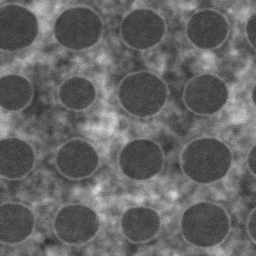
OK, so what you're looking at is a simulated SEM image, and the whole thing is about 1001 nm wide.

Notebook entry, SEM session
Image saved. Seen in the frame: a regular array of raised bodies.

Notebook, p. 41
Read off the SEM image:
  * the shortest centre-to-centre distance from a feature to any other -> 0.251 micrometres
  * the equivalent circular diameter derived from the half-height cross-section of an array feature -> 172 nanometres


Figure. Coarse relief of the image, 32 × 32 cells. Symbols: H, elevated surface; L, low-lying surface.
LHLLLLLLLLLLLLLLLLLLLLLLLLLLLLLL
HHHHLLLLHHHHLLLLHHHLLLLLHHHLLLLL
HHHHHLLHHHHHHLLHHHHHLLLHHHHHLLLH
HHHHHLLHHHHHHLLHHHHHHLLHHHHHHLLH
HHHHHLLHHHHHHLLHHHHHLLLHHHHHHLLH
HHHHLLLHHHHHLLLLHHHHLLLLHHHHLLLH
LHLLLLLLLLLLLLLLLLLLLLLLLLLLLLLL
LLLLLLLLLLLLLLLLLLLLLLLLLLLLLLLL
LLLLLLLLLLLLLLLLLLLLLLLLLLLLLLLL
HHHLLLLLLLLLLLLLHHHHLLLLLHHLLLLL
HHHHLLLLHHHHLLLHHHHHHLLHHHHHLLLL
HHHHLLLHHHHHLLLHHHHHHLLHHHHHHLLH
HHHHLLLHHHHHLLLHHHHHHLLHHHHHLLLH
HHHLLLLLHHHLLLLHHHHHLLLHHHHHLLLL
LLLLLLLLLLLLLLLLLHHLLLLLLLLLLLLL
LLLLLLLLLLLLLLLLLLLLLLLLLLLLLLLL
LLLLLLLLLLLLLLLLLLLLLLLLLLLLLLLL
HHHLLLLLLHHLLLLLLHHLLLLLHHHLLLLL
HHHHLLLHHHHHLLLHHHHHLLLHHHHHHLLH
HHHHLLLHHHHHLLLHHHHHLLHHHHHHHLLH
HHHHLLLHHHHHLLLHHHHHLLHHHHHHHLLH
HHHHLLLLHHHHLLLHHHHHLLLHHHHHHLLH
LLLLLLLLLLLLLLLLLHLLLLLLHHHLLLLL
LLLLLLLLLLLLLLLLLLLLLLLLLLLLLLLL
LLLLLLLLLLLLLLLLLLLLLLLLLLLLLLLL
HHHLLLLLLHLLLLLLLLLLLLLLHHHLLLLL
HHHHLLLHHHHHLLLLHHHHLLLHHHHHLLLH
HHHHLLLHHHHHLLLHHHHHLLLHHHHHHLLH
HHHHLLLHHHHHLLLHHHHHLLLHHHHHHLLH
HHHHLLLHHHHHLLLLHHHLLLLHHHHHLLLH
HHLLLLLLHHLLLLLLLLLLLLLLHHHHLLLL
LLLLLLLLLLLLLLLLLLLLLLLLLLLLLLLL